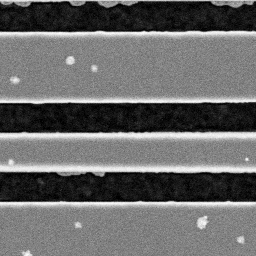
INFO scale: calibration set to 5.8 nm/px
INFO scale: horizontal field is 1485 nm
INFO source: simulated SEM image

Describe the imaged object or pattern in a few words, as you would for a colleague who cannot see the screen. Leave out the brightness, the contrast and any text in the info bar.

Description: lines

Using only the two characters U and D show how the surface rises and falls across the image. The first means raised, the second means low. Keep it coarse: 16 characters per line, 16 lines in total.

DDDDDDDDDDDDDDDD
DDDDDDDDDDDDDDDD
UUUUUUUUUUUUUUUU
UUUUUUUUUUUUUUUU
UUUUUUUUUUUUUUUU
UUUUUUUUUUUUUUUU
DDDDDDDDDDDDDDDD
DDDDDDDDDDDDDDDD
UUUUUUUUUUUUUUUU
UUUUUUUUUUUUUUUU
UUUUUUUUUUUUUUUU
DDDDDDDDDDDDDDDD
DDDDDDDDDDDDDDDD
UUUUUUUUUUUUUUUU
UUUUUUUUUUUUUUUU
UUUUUUUUUUUUUUUU